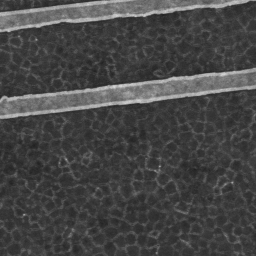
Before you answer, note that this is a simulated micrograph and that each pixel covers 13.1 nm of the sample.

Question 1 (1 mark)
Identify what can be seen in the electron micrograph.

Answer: one or a few lines or trenches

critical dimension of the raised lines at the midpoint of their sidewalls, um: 0.222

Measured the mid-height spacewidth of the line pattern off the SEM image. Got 914 nanometres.